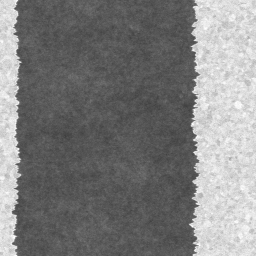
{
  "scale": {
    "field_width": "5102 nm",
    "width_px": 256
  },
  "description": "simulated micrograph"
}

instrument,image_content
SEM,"one or a few lines or trenches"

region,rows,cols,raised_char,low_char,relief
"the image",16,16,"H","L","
HLLLLLLLLLLLHHHH
HLLLLLLLLLLLHHHH
HLLLLLLLLLLLHHHH
HLLLLLLLLLLLHHHH
HLLLLLLLLLLLHHHH
HLLLLLLLLLLLHHHH
HLLLLLLLLLLLHHHH
HLLLLLLLLLLLHHHH
HLLLLLLLLLLLHHHH
HLLLLLLLLLLLHHHH
HLLLLLLLLLLLHHHH
HLLLLLLLLLLLHHHH
HLLLLLLLLLLLHHHH
HLLLLLLLLLLLHHHH
HLLLLLLLLLLLHHHH
HLLLLLLLLLLLHHHH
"